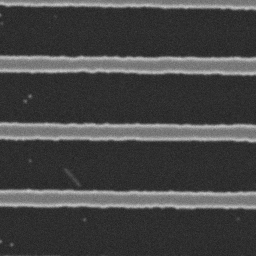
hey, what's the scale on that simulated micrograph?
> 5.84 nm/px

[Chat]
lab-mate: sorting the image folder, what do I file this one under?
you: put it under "lines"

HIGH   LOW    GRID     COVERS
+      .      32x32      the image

++++++++++++++++++++++++++++++++
................................
................................
................................
................................
................................
................................
++++++++++++++++++++++++++++++++
++++++++++++++++++++++++++++++++
................................
................................
................................
................................
................................
................................
+++++++.........................
++++++++++++++++++++++++++++++++
...........++.++.+++++++++++++++
................................
................................
................................
................................
................................
................................
++++++++++++++++++++++++++++++++
++++++++++++++++++++++++++++++++
................................
................................
................................
................................
................................
................................